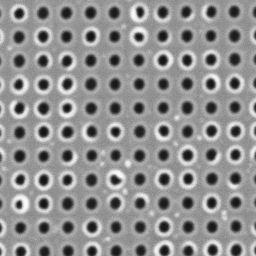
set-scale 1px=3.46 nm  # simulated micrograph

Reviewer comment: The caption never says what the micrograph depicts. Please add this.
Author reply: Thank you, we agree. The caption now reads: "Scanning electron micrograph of a regular array of holes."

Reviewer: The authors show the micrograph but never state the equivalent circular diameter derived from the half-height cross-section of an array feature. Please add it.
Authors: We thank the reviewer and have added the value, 40.1 nm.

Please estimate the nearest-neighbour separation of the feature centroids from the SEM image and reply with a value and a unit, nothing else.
81.7 nanometres